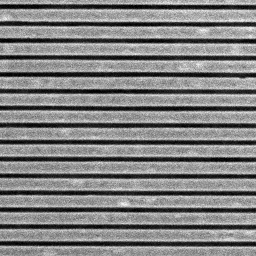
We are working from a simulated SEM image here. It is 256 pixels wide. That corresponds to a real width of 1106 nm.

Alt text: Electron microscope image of parallel lines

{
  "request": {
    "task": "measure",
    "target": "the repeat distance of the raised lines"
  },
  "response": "72.9 nanometres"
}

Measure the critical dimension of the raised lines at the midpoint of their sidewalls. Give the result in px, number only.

11.7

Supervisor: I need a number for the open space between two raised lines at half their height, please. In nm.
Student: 21